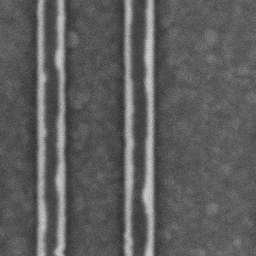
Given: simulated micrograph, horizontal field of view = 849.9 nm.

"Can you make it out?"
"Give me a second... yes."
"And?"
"one or a few lines or trenches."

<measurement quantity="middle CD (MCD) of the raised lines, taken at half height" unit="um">0.0784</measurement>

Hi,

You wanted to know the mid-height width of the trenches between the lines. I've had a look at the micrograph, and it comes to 0.214 µm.